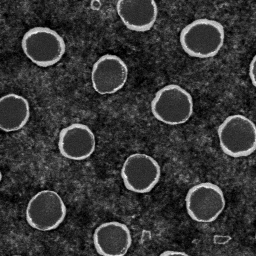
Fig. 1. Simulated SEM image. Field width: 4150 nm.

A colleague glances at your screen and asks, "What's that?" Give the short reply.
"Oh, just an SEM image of a regular array of raised bodies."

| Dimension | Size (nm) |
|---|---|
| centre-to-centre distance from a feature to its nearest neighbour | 1150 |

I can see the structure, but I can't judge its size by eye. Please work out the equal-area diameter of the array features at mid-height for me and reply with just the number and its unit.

0.596 microns